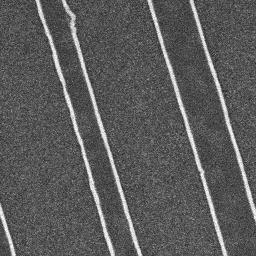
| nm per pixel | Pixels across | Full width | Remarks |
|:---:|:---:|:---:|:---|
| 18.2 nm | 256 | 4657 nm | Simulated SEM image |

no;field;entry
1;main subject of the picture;one or a few lines or trenches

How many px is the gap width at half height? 82.3